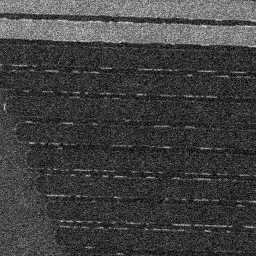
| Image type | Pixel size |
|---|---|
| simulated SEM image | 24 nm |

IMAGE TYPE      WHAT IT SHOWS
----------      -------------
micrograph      parallel lines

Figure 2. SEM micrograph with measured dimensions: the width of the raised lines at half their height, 467 nanometers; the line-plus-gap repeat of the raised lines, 618 nm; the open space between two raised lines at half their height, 144 nm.